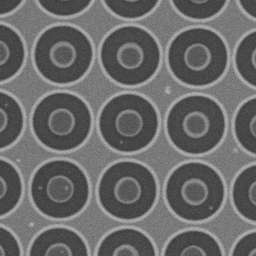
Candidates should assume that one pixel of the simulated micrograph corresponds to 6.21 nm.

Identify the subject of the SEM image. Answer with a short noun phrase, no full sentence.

an array of small figures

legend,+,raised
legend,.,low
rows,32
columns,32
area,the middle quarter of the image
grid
+......+++.....+++......++.....+
......++++.............+++......
.....++++++............++++.....
....+++++++...........++++++....
...++++++++++.......+++++++++...
++++++++++++++++.++++++++++++++.
++++++++++++++++++++++++++++++++
..++++++++++++....++++++++++++++
....++++++++.........++++++++...
.....++++++...........++++++....
......++++............+++++.....
......+++..............+++......
++.....++.....++++.....+++......
++.....++....++++++.....++.....+
++.....+.....++++++.....+.....++
++.....++....++++++.....+.....++
++.....++....++++++.....++.....+
......+++.....++++.....+++......
......+++..............+++......
.....+++++............+++++.....
....+++++++..........+++++++....
..+++++++++++.......+++++++++...
+++++++++++++++++++++++++++++++.
++++++++++++++++++++++++++++++++
..+++++++++++.....+++++++++++++.
....+++++++.........+++++++++...
.....+++++............+++++.....
.....+++++............++++......
+.....+++..............+++......
++....+++.....++++.....++.......
++....++.....++++++....++.....++
++.....+.....++++++....++.....++